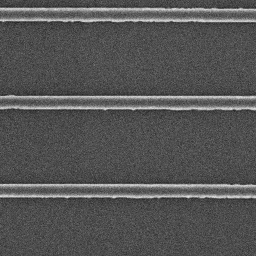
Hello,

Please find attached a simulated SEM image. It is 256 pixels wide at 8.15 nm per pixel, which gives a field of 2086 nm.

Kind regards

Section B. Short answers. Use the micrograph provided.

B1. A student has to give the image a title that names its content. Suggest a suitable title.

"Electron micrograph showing lines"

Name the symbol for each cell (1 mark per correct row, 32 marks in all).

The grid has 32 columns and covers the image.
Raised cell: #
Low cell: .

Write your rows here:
................................
################################
################################
................................
................................
................................
................................
................................
................................
................................
................................
................................
################################
#.##############################
................................
................................
................................
................................
................................
................................
................................
................................
................................
################################
################################
................................
................................
................................
................................
................................
................................
................................